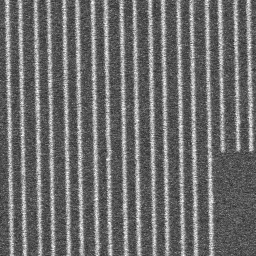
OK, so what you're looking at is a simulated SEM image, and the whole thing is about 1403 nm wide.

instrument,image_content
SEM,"parallel lines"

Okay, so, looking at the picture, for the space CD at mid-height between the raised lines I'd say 10.3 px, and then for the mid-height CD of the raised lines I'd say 18.5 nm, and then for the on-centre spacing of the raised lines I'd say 77.9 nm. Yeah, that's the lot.